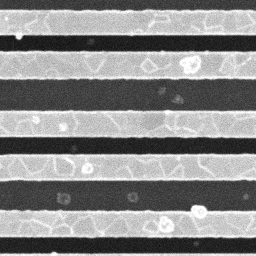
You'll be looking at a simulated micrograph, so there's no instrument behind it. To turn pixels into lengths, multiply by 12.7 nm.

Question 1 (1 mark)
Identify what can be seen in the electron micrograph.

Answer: lines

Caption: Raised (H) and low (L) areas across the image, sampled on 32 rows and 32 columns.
LLLLLLLLLLLLLLLLLLLLLLLLLLLLLLLL
HHHHHHHHHHHHHHHHHHHHHHHHHHHHHHHH
HHHHHHHHHHHHHHHHHHHHHHHHHHHHHHHH
HHHHHHHHHHHHHHHHHHHHHHHHHHHHHHHH
LLHLLLLLLLLLLLLLLLLLLLLLLLLLLLLL
LLLLLLLLLLLLLLLLLLLLLLLLLLLLLLLL
HLHHHHHLLLHLHLLLLLLLHLLLLHLLLLLL
HHHHHHHHHHHHHHHHHHHHHHHHHHHHHHHH
HHHHHHHHHHHHHHHHHHHHHHHHHHHHHHHH
HHHHHHHHHHHHHHHHHHHHHHHHHHHHHHHH
LLLLLLLLLLLLLLLLLLLLLLLLLLLLLLLL
LLLLLLLLLLLLLLLLLLLLLLLLLLLLLLLL
LLLLLLLLLLLLLLLLLLLLLLLLLLLLLLLL
LLLLLLLLLLLLLLLLLLLLLLLLLLLLLLLL
HHHHHHHHHHHHHHHHHHHHHHHHHHHHHHHH
HHHHHHHHHHHHHHHHHHHHHHHHHHHHHHHH
HHHHHHHHHHHHHHHHHHHHHHHHHHHHHHHH
LLLLLLLLLLLLLLLLLLLLLLLLLLLLLLLL
LLLLLLLLLLLLLLLLLLLLLLLLLLLLLLLL
HHHHHHHHHHHHHHHHHHHHHHHHHHHHHHHH
HHHHHHHHHHHHHHHHHHHHHHHHHHHHHHHH
HHHHHHHHHHHHHHHHHHHHHHHHHHHHHHHH
HLLLHLLLLLLLLLLLLLLLLLLLLLLLLLLL
LLLLLLLLLLLLLLLLLLLLLLLLLLLLLLLL
LLLLLLLLLLLLLLLLLLLLLLLLLLLLLLLL
LLLLLLLLLLLLLLLLLLLLLLLLLLLLLLLL
HHHHHHHHHHHHHHHHHHHHHHHHHHHHHHHH
HHHHHHHHHHHHHHHHHHHHHHHHHHHHHHHH
HHHHHHHHHHHHHHHHHHHHHHHHHHHHHHHH
HHHHHHHHHHHHHHHHHHHHHHHHHHHHHHHH
LLLLLLLLLLLLLLLLLLLLLLLLLLLLLLLL
LLLLLLLLLLLLLLLLLLLLLLLLLLLLLLLL